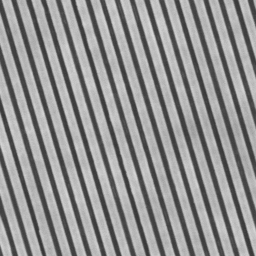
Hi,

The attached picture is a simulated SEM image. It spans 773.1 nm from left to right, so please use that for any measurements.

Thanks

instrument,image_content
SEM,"parallel lines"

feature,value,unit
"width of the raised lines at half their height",26.4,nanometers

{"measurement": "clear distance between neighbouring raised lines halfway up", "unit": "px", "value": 4.93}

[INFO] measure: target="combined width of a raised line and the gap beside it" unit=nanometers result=42.8